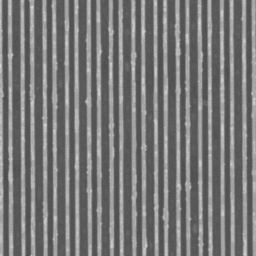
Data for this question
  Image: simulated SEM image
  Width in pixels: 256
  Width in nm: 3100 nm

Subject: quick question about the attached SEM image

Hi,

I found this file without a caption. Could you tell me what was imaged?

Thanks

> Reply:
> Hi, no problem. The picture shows parallel lines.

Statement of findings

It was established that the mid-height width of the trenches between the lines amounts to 6.37 pixels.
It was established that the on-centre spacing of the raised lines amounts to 135 nm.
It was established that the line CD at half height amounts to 43.9 nanometres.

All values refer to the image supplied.